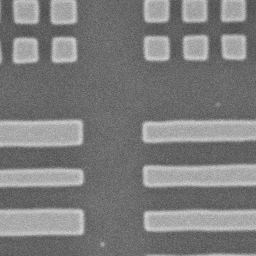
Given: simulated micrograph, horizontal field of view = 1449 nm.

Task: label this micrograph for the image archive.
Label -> groups of lines, slits or small figures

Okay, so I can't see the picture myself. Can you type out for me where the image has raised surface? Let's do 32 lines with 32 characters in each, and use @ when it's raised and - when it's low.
--@@@-@@@---------@@@--@@@--@@@-
--@@@-@@@---------@@@--@@@--@@@-
--@@@-@@@---------@@@--@@@--@@--
--------------------------------
--------------------------------
--@@@--@@---------@@@--@@@--@@@-
--@@@--@@---------@@@--@@@--@@@-
--@@@--@@----------@@-----------
--------------------------------
--------------------------------
--------------------------------
--------------------------------
--------------------------------
--------------------------------
--------------------------------
@@@@@@@@@@--------@@@@@@@@@@@@@@
@@@@@@@@@@--------@@@@@@@@@@@@@@
@@@@@@@@@@--------@@@@@@@@@@@@@-
--------------------------------
--------------------------------
--------------------------------
@@@@@@@@@@--------@@@@@@@@@@@@@@
@@@@@@@@@@--------@@@@@@@@@@@@@@
--------------------------------
--------------------------------
--------------------------------
@@@@@@@@@@---------@@@@@@@@@@@@@
@@@@@@@@@@--------@@@@@@@@@@@@@@
@@@@@@@@@@--------@@@@@@@@@@@@@@
--------------------------------
--------------------------------
--------------------------------